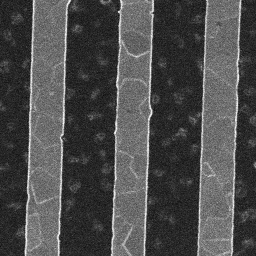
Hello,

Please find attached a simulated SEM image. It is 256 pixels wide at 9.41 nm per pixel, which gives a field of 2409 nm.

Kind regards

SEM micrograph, one or a few lines or trenches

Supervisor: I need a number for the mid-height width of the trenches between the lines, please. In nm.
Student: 507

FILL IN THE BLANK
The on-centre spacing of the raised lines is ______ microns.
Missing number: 0.812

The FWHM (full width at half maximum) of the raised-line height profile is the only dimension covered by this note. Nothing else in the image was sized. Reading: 314 nm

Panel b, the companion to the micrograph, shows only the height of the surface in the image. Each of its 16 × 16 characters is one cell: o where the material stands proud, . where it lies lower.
..oo....oo...oo.
..oo...ooo...oo.
..oo....o....oo.
..oo...oo....oo.
..oo...oo....oo.
..oo...oo....oo.
..oo...oo....oo.
..oo...oo....oo.
..oo...oo....oo.
..oo...oo....oo.
..oo...oo....oo.
..oo...oo....oo.
..oo...oo....oo.
..oo...oo...ooo.
..oo...oo...ooo.
..oo...oo...oo..